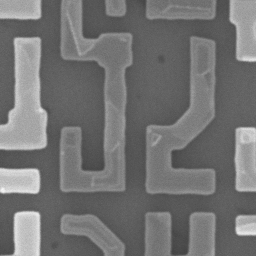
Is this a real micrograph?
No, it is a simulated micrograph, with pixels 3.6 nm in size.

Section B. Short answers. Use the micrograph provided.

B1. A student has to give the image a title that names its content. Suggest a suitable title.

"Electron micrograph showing wiring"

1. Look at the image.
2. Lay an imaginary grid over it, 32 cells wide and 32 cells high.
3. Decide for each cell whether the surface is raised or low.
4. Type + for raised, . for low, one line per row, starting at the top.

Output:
+++++...++...+++..+++++++++..+++
+++++...++...+++..+++++++++..+++
........++...................+++
........++....................++
........++...+++..............++
..+++...++++++++........+++...++
..+++...++++++++........+++...++
..+++.......++++........+++....+
..+++........+++........+++.....
..+++........+++........+++.....
..+++........+++........+++.....
..+++........+++........+++.....
..+++........+++........+++.....
..+++........+++........+++.....
.+++++.......+++.......++++.....
.+++++.......+++......++++......
++++++..++...+++..+++++++.....++
++++++..++...+++..++++++......++
+++++...++...+++..+++++.......++
........++...+++..+++........+++
........++...+++..+++........+++
+++++...++++++++..+++++++++...++
+++++...++++++++..+++++++++...++
+++++...++++++++..+++++++++...++
................................
................................
................................
..+++...++++......+++...+++...++
..+++...+++++.....+++...+++...++
..+++......+++....+++...+++.....
..+++.......+++...+++...+++.....
..+++........+++..+++...+++.....